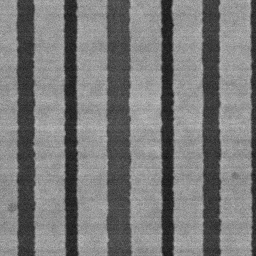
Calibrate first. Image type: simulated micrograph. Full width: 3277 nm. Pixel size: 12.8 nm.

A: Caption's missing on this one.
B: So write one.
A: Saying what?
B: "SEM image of lines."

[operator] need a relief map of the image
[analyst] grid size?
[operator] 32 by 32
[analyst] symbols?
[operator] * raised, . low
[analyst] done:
**..****..***...****..***...***.
**..****..***...****..***..****.
**..****..***...****..***...***.
**..****..***...****..***...***.
**..****..***...****..***..****.
**..****..***...****..***...***.
**..****..***...****..***...***.
**..****..***...****..***...***.
**..****..***...****..***..****.
**..****..***...****..***...***.
**..****..***...****..***..****.
**..****..***...****..***..****.
**..****..***...****..***...***.
**..****..***...****..***...***.
**..****..***...****..***..****.
**..****..***...****..***..****.
**..****..***...****..***...***.
**..****..***...****..***...***.
**..****..***...****..***...***.
**..****..***...****..***...***.
**..****..***...****..***...***.
**..****..***...****..***...***.
**..****..***...****..***...***.
**..****..***...****..***...***.
**..****..***...****..***...***.
**..****..***...****..***...***.
**..****..***...****..***...***.
**..****..***...****..***...***.
**..****..***...****..***...***.
**..****..***...****..***...***.
**..****..***...****..***...***.
**..****..***...****..***...***.